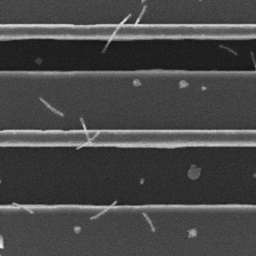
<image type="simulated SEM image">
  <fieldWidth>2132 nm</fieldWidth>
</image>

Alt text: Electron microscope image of lines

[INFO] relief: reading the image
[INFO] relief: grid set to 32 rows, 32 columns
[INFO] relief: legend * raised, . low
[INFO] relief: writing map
********************************
********************************
********************************
********************************
********************************
................................
................................
................................
................................
********************************
********************************
********************************
********************************
********************************
********************************
********************************
********************************
********************************
................................
................................
................................
................................
................................
................................
................................
................................
********************************
********************************
********************************
********************************
********************************
********************************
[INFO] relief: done